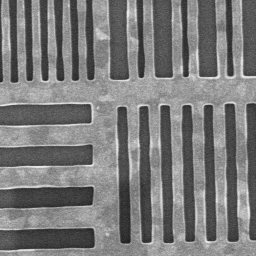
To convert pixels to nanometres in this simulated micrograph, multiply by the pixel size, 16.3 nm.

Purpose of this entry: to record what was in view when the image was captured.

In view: groups of lines, slits or small figures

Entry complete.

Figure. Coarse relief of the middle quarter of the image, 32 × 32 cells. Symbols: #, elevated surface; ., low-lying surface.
##..#...###.....##..##.....##...
##..#...###.....##..##.....##...
##..##..###.....##..###.....##.#
##..##..###.....###.###....#####
################################
################################
################################
################################
################################
################################
.......#######.####..###..####..
.......######...###..###...##...
.......######...###..###...##...
.......######...###..###...##...
.......######...###..###...##...
#############...###...##...##...
#############...###...##...##...
#############...###...##...##...
#############...###...##...##...
#############...###...##...##...
.......######...###...##...##...
.......######...###...##...##...
.......######...###...##...###..
.......######....##...##...###..
.......######....##...##...###..
..###########....##...##...###..
#############....##...##...###..
#############....##...##...###..
#############....##...##...###..
#############....##...##...###..
######.######....##...##...###..
........#####....##...##...###..